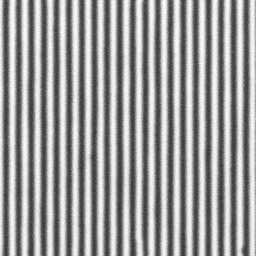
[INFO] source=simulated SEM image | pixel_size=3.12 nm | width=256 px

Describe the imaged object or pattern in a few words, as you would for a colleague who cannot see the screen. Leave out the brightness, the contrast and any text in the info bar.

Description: parallel lines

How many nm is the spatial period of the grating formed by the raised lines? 39.4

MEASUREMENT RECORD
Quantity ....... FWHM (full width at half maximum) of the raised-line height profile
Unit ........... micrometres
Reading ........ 0.016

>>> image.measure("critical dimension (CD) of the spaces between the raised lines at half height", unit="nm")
24.2